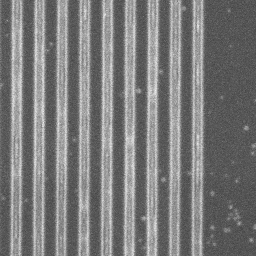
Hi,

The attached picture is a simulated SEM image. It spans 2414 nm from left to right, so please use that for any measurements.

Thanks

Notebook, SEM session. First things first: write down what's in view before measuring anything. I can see parallel lines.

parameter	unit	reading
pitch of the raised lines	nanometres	213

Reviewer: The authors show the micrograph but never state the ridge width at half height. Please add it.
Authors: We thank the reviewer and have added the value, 0.15 micrometres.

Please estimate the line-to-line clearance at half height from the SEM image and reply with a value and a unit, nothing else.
6.74 pixels